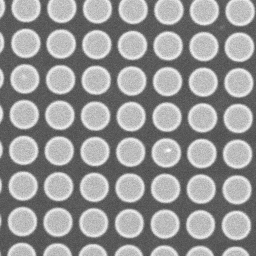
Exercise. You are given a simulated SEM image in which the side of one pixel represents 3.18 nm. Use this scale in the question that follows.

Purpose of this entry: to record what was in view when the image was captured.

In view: an array of small figures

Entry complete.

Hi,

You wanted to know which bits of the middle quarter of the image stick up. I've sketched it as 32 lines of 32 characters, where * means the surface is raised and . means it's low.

*...............................
**....*****...*****.....****....
**...******...******...******...
***..******..*******..*******..*
***..******..*******..*******..*
**...******...******..*******..*
**...******...******...******...
...............***......****....
................................
................................
**...*****....*****....*****....
**..*******...******...******..*
***.*******..*******..*******..*
***.*******..*******..*******..*
**...******..*******..*******..*
*....******...******...******...
...............***......***.....
................................
*.....***.......................
**...*****....*****....*****....
**..*******..*******...******..*
**..*******..*******..*******..*
**..*******..*******..*******..*
**..*******..*******..*******..*
*....*****....*****....*****...*
................*.......***.....
................................
......***................*......
**...*****....*****....*****....
**..*******..*******..*******..*
**..*******..*******..*******..*
**..*******..*******..*******..*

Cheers